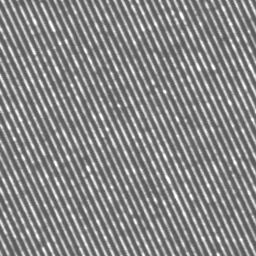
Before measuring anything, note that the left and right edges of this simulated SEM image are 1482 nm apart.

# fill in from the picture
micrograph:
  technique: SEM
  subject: parallel lines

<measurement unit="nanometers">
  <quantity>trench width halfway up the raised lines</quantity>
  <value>29.5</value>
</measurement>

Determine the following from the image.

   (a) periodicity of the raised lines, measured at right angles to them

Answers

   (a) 39.3 nm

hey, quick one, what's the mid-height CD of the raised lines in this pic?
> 8.5 nanometers